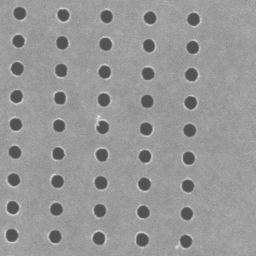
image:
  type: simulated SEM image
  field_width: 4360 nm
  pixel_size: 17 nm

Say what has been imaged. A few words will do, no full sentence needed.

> a regular array of holes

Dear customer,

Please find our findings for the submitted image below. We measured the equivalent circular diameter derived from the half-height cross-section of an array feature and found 219 nanometres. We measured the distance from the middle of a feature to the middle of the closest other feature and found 0.47 µm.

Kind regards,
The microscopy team